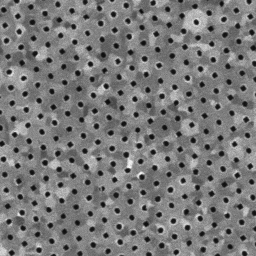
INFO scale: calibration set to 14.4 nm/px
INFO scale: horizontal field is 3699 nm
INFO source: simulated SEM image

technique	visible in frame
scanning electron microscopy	a regular array of holes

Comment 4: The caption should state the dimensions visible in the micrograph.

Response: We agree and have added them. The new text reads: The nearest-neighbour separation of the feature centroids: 222 nanometers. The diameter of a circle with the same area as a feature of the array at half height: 87.8 nm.